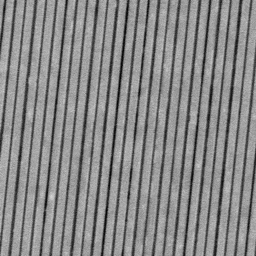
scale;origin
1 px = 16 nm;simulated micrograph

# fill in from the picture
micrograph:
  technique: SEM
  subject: parallel lines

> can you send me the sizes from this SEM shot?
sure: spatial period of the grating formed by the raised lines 0.163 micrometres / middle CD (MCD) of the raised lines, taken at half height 117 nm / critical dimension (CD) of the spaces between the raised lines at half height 43.7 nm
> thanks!